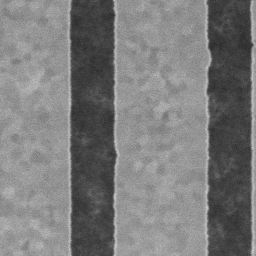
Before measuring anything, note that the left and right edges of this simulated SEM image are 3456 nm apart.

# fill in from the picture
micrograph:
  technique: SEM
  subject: one or a few lines or trenches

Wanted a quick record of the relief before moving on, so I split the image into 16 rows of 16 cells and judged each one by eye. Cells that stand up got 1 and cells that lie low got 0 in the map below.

1111000111111000
1111000111111000
1111000111111000
1111000111111000
1111000111111000
1111000111111000
1111000111111000
1111000111111000
1111000111111000
1111000111111000
1111000111111000
1111000111111000
1111000111111000
1111000111111000
1111000111111000
1111000111111000